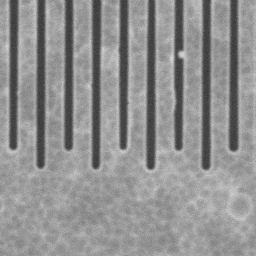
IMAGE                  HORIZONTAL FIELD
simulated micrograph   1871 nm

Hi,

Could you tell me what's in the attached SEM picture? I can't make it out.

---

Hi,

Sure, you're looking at parallel lines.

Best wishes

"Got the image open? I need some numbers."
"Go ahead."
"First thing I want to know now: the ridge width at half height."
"17 pixels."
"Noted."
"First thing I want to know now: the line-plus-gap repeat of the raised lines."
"202 nanometres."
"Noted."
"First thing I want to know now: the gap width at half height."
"75 nm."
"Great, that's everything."